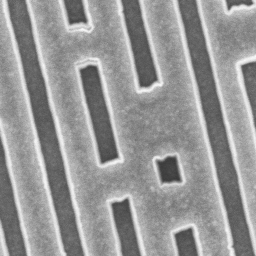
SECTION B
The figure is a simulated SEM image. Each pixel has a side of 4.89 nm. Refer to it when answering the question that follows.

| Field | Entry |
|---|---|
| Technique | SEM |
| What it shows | parallel lines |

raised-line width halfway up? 166 nanometres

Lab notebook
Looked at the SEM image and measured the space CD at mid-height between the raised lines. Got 0.102 um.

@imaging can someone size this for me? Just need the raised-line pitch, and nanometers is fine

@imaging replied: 268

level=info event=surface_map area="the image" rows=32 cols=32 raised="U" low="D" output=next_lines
UDDUUUUUDDDUUUUDDDUUUUDDDUUUDDDD
UDDDUUUUDDDUUUUDDDUUUUDDDUUUUUUU
UDDDUUUUDDDUUUUDDDUUUUDDDUUUUUUU
UDDDUUUUUUUUUUUUDDUUUUUDDUUUUUUU
UUDDUUUUUUUUUUUUDDDUUUUDDDUUUUUU
UUDDDUUUUUUUUUUUDDDUUUUDDDUUUUUU
UUDDDUUUUUUUUUUUDDDUUUUDDDUUUUUU
UUDDDUUUUUUUUUUUUDDUUUUUDDUUUUUU
UUUDDUUUUUDDUUUUUDDDUUUUDDDUUUDD
UUUDDDUUUUDDDUUUUDDDUUUUDDDUUUDD
UUUDDDUUUUDDDUUUUDDUUUUUDDDUUUDD
UUUDDDUUUUDDDUUUUUUUUUUUUDDUUUUD
UUUUDDUUUUUDDUUUUUUUUUUUUDDDUUUD
UUUUDDDUUUUDDDUUUUUUUUUUUDDDUUUD
UUUUDDDUUUUDDDUUUUUUUUUUUDDDUUUD
UUUUDDDUUUUDDDUUUUUUUUUUUDDDUUUU
UUUUDDDUUUUUDDUUUUUUUUUUUUDDDUUU
UUUUUDDUUUUUDDUUUUUUUUUUUUDDDUUU
DUUUUDDDUUUUDDDUUUUUUUUUUUDDDUUU
DUUUUDDDUUUUDDDUUUUUUDUUUUDDDUUU
DUUUUDDDUUUUUUUUUUUUDDUUUUUDDUUU
DUUUUUDDUUUUUUUUUUUUDDUUUUUDDDUU
DDUUUUDDDUUUUUUUUUUUDDDUUUUDDDUU
DDUUUUDDDUUUUUUUUUUUUUUUUUUDDDUU
DDUUUUDDDUUUUUUUUUUUUUUUUUUUDDUU
DDUUUUDDDUUUUUDDUUUUUUUUUUUUDDDU
DDUUUUUDDDUUUUDDDUUUUUUUUUUUDDDU
DDDUUUUDDDUUUUDDDUUUUUUUUUUUDDDU
DDDUUUUDDDUUUUDDDUUUUUUDUUUUUDDU
DDDUUUUDDDUUUUUDDUUUUUDDUUUUUDDD
UDDUUUUUDDUUUUUDDUUUUUDDDUUUUDDD
UDDUUUUUDDDUUUUDDDUUUUDDDUUUUDDD